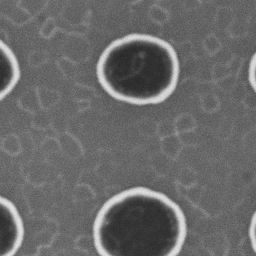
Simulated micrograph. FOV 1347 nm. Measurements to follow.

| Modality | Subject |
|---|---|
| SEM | raised bodies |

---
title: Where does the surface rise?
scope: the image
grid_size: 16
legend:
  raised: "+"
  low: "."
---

................
................
........++......
+.....+++++.....
+.....+++++.....
+......++++.....
................
................
................
................
................
................
.......+++......
+.....+++++.....
+.....+++++.....
+.....+++++.....